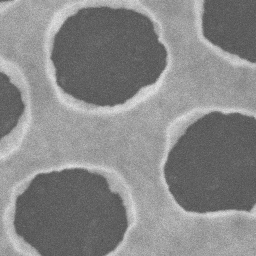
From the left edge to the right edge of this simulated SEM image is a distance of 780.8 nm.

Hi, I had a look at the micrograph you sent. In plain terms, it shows holes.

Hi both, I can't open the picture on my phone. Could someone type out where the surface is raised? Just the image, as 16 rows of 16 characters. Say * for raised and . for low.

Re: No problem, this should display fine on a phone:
*****...*****...
****......***...
***.......***...
***.......*****.
***.......******
.***.....*******
..***...********
.***********....
.**********.....
***********.....
****.*****......
**.....***......
*.......***.....
*.......********
*.......********
**.....*********